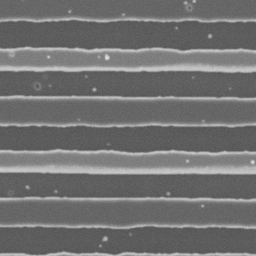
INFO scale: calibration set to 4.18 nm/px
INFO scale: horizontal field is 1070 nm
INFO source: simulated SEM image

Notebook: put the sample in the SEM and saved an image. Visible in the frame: lines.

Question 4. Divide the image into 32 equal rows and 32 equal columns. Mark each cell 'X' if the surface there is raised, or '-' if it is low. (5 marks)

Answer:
XXXXXXXXXXXXXXXXXXXXXXXXXXXXXXXX
XXXXXXXXXXXXXXXXXXXXXXXXXXXXXXXX
XXXXXXX---XXXXX--XXXXXX-XXXXXXXX
--------------------------------
--------------------------------
--------------------------------
XXXXXXXXXXXXXXXXXXXXXXXXXXXXXXXX
XXXXXXXXXXXXXXXXXXXXXXXXXXXXXXXX
XXXXXXXXXXXXXXXXXXXXXXXXXXXXXXXX
--------------------------------
--------------------------------
--------------------------------
XXXXXXXXXXXXXXXXXXXXXXXXXXXXXXXX
XXXXXXXXXXXXXXXXXXXXXXXXXXXXXXXX
XXXXXXXXXXXXXXXXXXXXXXXXXXXXXXXX
XXXXXXXXXXXXXXXXXXXXXXXXXXXXXXXX
--------------------------------
--------------------------------
--------------------------------
XXXXXXXXXXXXXXXXXXXXXXXXXXXXXXXX
XXXXXXXXXXXXXXXXXXXXXXXXXXXXXXXX
---------------XX-X-------------
--------------------------------
--------------------------------
--------------------------------
XXXXXXXXXXXXXXXXXXXXXXXXXXXXXXXX
XXXXXXXXXXXXXXXXXXXXXXXXXXXXXXXX
XXXXXXXXXXXXXXXXXXXXXXXXXXXXXXXX
--------------XX--------------XX
--------------------------------
--------------------------------
--------------------------------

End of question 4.